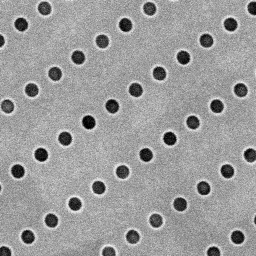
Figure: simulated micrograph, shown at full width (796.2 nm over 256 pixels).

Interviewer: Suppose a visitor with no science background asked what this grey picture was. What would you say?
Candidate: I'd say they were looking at a regular array of holes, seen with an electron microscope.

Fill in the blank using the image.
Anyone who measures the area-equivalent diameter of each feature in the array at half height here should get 44.9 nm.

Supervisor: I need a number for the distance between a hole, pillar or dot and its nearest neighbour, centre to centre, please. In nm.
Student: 88.7